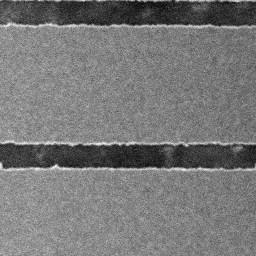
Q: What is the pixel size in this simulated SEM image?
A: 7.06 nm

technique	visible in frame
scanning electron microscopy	one or a few lines or trenches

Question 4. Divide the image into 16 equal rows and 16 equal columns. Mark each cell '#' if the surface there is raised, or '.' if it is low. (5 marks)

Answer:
................
................
################
################
################
################
################
################
################
................
...#............
################
################
################
################
################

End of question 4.